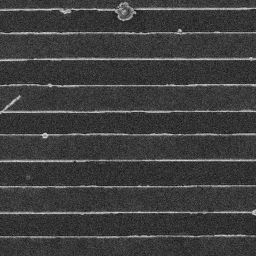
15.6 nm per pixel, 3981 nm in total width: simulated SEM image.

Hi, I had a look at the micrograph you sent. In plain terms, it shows lines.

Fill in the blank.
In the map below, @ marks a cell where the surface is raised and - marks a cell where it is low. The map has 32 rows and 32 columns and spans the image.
@@@@@@@@@@@@@@@@@@@@@@@@@@@@@@@@
--------------@@@---------------
---------------@----------------
--------------------------------
@@@@@@@@@@@@@@@@@@@@@@@@@@@@@@@@
@@@@@@@@@@@@@@@@@@@@@@@@@@@@@@@@
@@@@@@@@@@@@@@@@@@@@@@@@@@@@@@@@
@@------------------------------
--------------------------------
--------------------------------
--------------------------------
@@@@@@@@@@@@@@@@@@@@@@@@@@@@@@@@
@@@@@@@@@@@@@@@@@@@@@@@@@@@@@@@@
@@@@@@@@@@@@@@@@@@@@@@@@@@@@@@@@
--------------------------------
--------------------------------
--------------------------------
@@@@@@@@@@@@@@@@@@@@@@@@@@@@@@@@
@@@@@@@@@@@@@@@@@@@@@@@@@@@@@@@@
@@@@@@@@@@@@@@@@@@@@@@@@@@@@@@@@
--------------------------------
--------------------------------
--------------------------------
@@@@@@@@@@@@@@@@@@@@@@@@@@@@@@@@
@@@@@@@@@@@@@@@@@@@@@@@@@@@@@@@@
@@@@@@@@@@@@@@@@@@@@@@@@@@@@@@@@
@@@@@@@@@@@@@@@@@@@@@@@@@@@@@@@@
--------------------------------
--------------------------------
---------------------------@@@@-
@@@@@@@@@@@@@@@@@@@@@@@@@@@@@@@@
@@@@@@@@@@@@@@@@@@@@@@@@@@@@@@@@